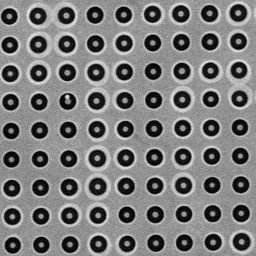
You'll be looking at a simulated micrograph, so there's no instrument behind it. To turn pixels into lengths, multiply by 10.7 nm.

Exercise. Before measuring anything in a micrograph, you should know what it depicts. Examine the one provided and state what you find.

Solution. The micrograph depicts an array of small figures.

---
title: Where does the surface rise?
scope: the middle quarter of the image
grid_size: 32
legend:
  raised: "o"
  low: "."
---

...ooo....ooo....oooo...oooo...o
...ooo.....oo....ooo....ooo.....
...ooo.....oo....ooo....ooo.....
...ooo....ooo....oooo...oooo...o
ooooooo...ooooooooooooooooooo.oo
oooooooooooooooooooooooooooooooo
oooooooo.ooooooooooooooooooo...o
..oooo....ooo....oooo...ooo.....
...ooo.....oo....ooo.....oo.....
...ooo.....oo....ooo.....oo.....
...ooo....ooo....oooo...ooo.....
ooooooo..oooooooooooooooooooo.oo
oooooooooooooooooooooooooooooooo
oooooooooooooooooooooooooooooooo
..ooooo...oooo...oooo...oooo...o
...ooo.....oo....ooo.....ooo....
...ooo.....oo....ooo.....oo.....
...ooo....ooo....oooo...oooo...o
..ooooo...ooooo.oooooooooooooooo
oooooooooooooooooooooooooooooooo
oooooooooooooooooooooooooooooooo
ooooooo...oooo...oooo...oooo...o
...ooo.....oo....oooo....oo.....
....oo.....oo.....oo.....oo.....
...ooo.....oo.....ooo....ooo....
...oooo...oooo...ooooo.ooooo...o
oooooooooooooooooooooooooooooooo
oooooooooooooooooooooooooooooooo
ooooooo...oooo..oooooo..oooo....
...ooo.....oo....oooo....oo.....
....oo.....oo.....oo.....oo.....
....oo.....oo.....ooo....ooo....